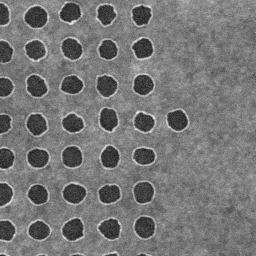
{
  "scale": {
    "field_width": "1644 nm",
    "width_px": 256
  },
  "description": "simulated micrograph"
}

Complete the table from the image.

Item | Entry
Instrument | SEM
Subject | a regular array of holes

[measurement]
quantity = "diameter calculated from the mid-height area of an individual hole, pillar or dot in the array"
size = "140 nm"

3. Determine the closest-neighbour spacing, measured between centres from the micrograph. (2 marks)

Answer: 0.22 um